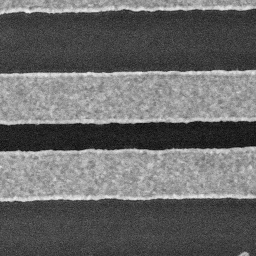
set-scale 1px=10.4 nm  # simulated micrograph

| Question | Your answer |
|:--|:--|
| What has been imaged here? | lines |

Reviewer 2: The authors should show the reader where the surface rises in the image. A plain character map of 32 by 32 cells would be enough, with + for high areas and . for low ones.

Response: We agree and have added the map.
++++++++++++++++++++++++++++++++
+.....+.........................
................................
................................
................................
................................
................................
................................
................................
++++++++++++++++++++++++++++++++
++++++++++++++++++++++++++++++++
++++++++++++++++++++++++++++++++
++++++++++++++++++++++++++++++++
++++++++++++++++++++++++++++++++
++++++++++++++++++++++++++++++++
++..............................
................................
................................
...............................+
++++++++++++++++++++++++++++++++
++++++++++++++++++++++++++++++++
++++++++++++++++++++++++++++++++
++++++++++++++++++++++++++++++++
++++++++++++++++++++++++++++++++
++++++++++++++++++++++++++++++++
................................
................................
................................
................................
................................
................................
................................